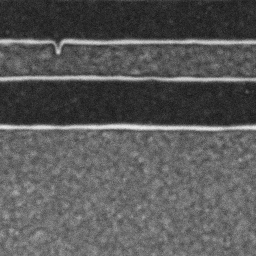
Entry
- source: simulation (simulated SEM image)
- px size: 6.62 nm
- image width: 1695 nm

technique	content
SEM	one or a few lines or trenches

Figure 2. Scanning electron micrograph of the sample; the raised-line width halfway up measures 329 nm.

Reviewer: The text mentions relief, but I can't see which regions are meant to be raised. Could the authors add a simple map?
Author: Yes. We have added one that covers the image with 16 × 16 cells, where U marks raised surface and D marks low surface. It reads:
UUUUUUUUUUUUUUUU
UUUUUUUUUUUUUUUU
UUUUUUUUUUUUUUUU
DDDDDDDDDDDDDDDD
DDDDDDDDDDDDDDDD
UUUUUUUUUUUUUUUU
UUUUUUUUUUUUUUUU
UUUUUUUUUUUUUUUU
DDDDDDDDDDDDDDDD
DDDDDDDDDDDDDDDD
DDDDDDDDDDDDDDDD
DDDDDDDDDDDDDDDD
DDDDDDDDDDDDDDDD
DDDDDDDDDDDDDDDD
DDDDDDDDDDDDDDDD
DDDDDDDDDDDDDDDD